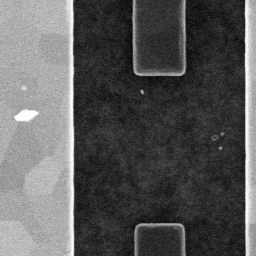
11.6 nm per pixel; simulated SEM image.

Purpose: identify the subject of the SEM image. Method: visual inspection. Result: wiring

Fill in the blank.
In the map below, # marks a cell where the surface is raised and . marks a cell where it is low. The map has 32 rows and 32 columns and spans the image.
#########........######........#
#########........######........#
#########........######........#
#########........######........#
#########........######........#
#########........######........#
#########........######........#
#########........######........#
#########........######........#
#########......................#
#########......................#
#########......................#
#########......................#
#########......................#
#########......................#
#########......................#
#########......................#
#########......................#
#########......................#
#########......................#
#########......................#
#########......................#
#########......................#
#########......................#
#########......................#
#########......................#
#########......................#
#########......................#
#########........######........#
#########........######........#
#########........######........#
#########........######........#